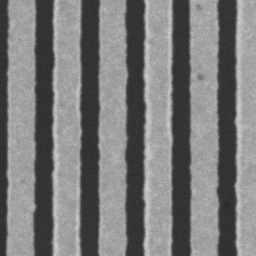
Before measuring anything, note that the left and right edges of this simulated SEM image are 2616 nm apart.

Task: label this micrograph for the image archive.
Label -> lines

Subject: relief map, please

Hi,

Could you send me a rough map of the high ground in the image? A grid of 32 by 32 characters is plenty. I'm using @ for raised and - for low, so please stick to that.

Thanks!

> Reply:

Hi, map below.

-@@@---@@@---@@@--@@@---@@@---@@
-@@@---@@@--@@@@--@@@---@@@---@@
-@@@---@@@--@@@@--@@@---@@@---@@
-@@@---@@@--@@@@--@@@---@@@---@@
-@@@---@@@--@@@@--@@@---@@@---@@
-@@@---@@@---@@@--@@@---@@@---@@
-@@@---@@@--@@@@--@@@---@@@---@@
-@@@---@@@---@@@--@@@---@@@---@@
-@@@---@@@--@@@@--@@@---@@@---@@
-@@@---@@@--@@@@--@@@---@@@---@@
-@@@---@@@--@@@@--@@@---@@@---@@
-@@@---@@@--@@@@--@@@---@@@---@@
-@@@---@@@--@@@@--@@@---@@@---@@
-@@@---@@@---@@@--@@@---@@@---@@
-@@@---@@@--@@@@--@@@---@@@---@@
-@@@---@@@--@@@@--@@@---@@@---@@
-@@@---@@@--@@@@--@@@---@@@---@@
-@@@---@@@--@@@@--@@@---@@@---@@
-@@@---@@@--@@@@--@@@---@@@---@@
-@@@---@@@--@@@@--@@@---@@@---@@
-@@@---@@@--@@@@--@@@---@@@---@@
-@@@---@@@--@@@@--@@@---@@@---@@
-@@@---@@@--@@@@--@@@---@@@---@@
-@@@---@@@--@@@@--@@@---@@@---@@
-@@@---@@@--@@@@--@@@---@@@---@@
-@@@---@@@--@@@@--@@@---@@@---@@
-@@@---@@@---@@@--@@@---@@@---@@
-@@@---@@@--@@@@--@@@---@@@---@@
-@@@---@@@--@@@@--@@@---@@@---@@
-@@@---@@@--@@@@--@@@---@@@---@@
-@@@---@@@--@@@@--@@@---@@@---@@
-@@@---@@@--@@@@--@@@---@@@---@@